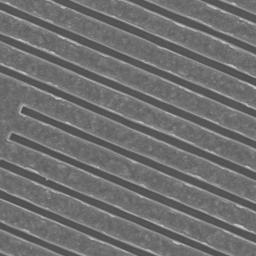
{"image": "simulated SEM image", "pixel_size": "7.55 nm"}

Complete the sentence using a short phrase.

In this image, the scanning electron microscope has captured parallel lines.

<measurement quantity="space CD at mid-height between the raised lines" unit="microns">0.0592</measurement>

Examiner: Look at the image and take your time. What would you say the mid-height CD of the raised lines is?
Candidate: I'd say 0.159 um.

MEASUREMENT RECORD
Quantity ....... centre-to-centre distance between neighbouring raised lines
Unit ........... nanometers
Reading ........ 218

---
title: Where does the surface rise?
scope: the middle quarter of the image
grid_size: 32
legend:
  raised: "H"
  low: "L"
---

LLLLHHHHHHHHHHHHHLLLLLHHHHHHHHHH
HLLLLLHHHHHHHHHHHHHHLLLLLHHHHHHH
HHHHLLLLHHHHHHHHHHHHHHLLLLLHHHHH
HHHHHLLLLLLHHHHHHHHHHHHHHLLLLHHH
HHHHHHHHLLLLLLHHHHHHHHHHHHHLLLLL
HHHHHHHHHHHLLLLHHHHHHHHHHHHHHLLL
HHHHHHHHHHHHHLLLLLHHHHHHHHHHHHHL
LHHHHHHHHHHHHHHLLLLLHHHHHHHHHHHH
LLLLHHHHHHHHHHHHHHLLLLLHHHHHHHHH
HLLLLLHHHHHHHHHHHHHHLLLLLHHHHHHH
HHHHLLLLLHHHHHHHHHHHHHLLLLLLHHHH
HHHHHHLLLLLHHHHHHHHHHHHHLLLLLLHH
HHHHHHHHLLLLLHHHHHHHHHHHHHHLLLLL
HHHHHHHHHHHLLLLLHHHHHHHHHHHHHLLL
HHHHHHHHHHHHHLLLLLHHHHHHHHHHHHHH
LLHHHHHHHHHHHHHLLLLLHHHHHHHHHHHH
LLLLHHHHHHHHHHHHHHLLLLLHHHHHHHHH
HLLLLLHHHHHHHHHHHHHHLLLLLLHHHHHH
HHHHLLLLLHHHHHHHHHHHHHLLLLLLHHHH
HHHHHHHLLLLHHHHHHHHHHHHHHLLLLLLH
HHHHHHHHHLLLLLHHHHHHHHHHHHHLLLLL
HHHHHHHHHHHLLLLLHHHHHHHHHHHHHLLL
HHHHHHHHHHHHHHLLLLLHHHHHHHHHHHHH
LLHHHHHHHHHHHHHHLLLLLHHHHHHHHHHH
LLLLHHHHHHHHHHHHHHLLLLLLHHHHHHHH
HHLLLLLHHHHHHHHHHHHHLLLLLLHHHHHH
HHHHLLLLLHHHHHHHHHHHHHHLLLLLHHHH
HHHHHHHLLLLLHHHHHHHHHHHHHLLLLLLH
HHHHHHHHHLLLLLHHHHHHHHHHHHHLLLLL
HHHHHHHHHHHHLLLLLHHHHHHHHHHHHHLL
HHHHHHHHHHHHHHLLLLLHHHHHHHHHHHHH
LLHHHHHHHHHHHHHHLLLLLLHHHHHHHHHH